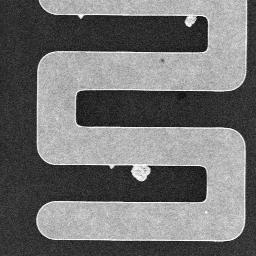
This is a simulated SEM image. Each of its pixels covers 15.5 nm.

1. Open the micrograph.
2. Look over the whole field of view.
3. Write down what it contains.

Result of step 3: groups of lines, slits or small figures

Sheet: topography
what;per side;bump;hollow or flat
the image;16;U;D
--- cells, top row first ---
DDDUUUUUUUUUUUUD
DDDDDDDDDDDDDUUD
DDDDDDDDDDDDDUUD
DDDUUUUUUUUUUUUD
DDUUUUUUUUUUUUUD
DDUUUUUUUUUUUUUD
DDUUUDDDDDDDDDDD
DDUUUDDDDDDDDDDD
DDUUUUUUUUUUUUUD
DDUUUUUUUUUUUUUD
DDDDDDDDDDDDDUUD
DDDDDDDDDDDDDUUD
DDDDDDDDDDDDDUUD
DDUUUUUUUUUUUUUD
DDDUUUUUUUUUUUUD
DDDDDDDDDDDDDDDD